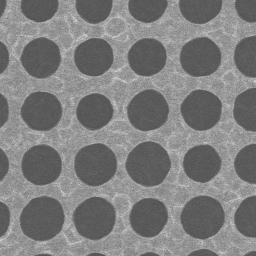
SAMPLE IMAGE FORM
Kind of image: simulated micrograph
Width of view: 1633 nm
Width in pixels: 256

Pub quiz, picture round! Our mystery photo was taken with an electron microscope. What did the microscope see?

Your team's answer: a regular array of holes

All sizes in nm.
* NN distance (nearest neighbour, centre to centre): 338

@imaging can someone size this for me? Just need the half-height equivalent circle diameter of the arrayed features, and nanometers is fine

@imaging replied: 257